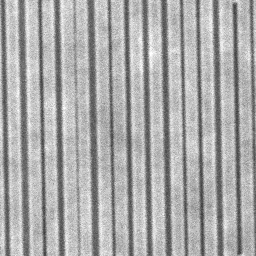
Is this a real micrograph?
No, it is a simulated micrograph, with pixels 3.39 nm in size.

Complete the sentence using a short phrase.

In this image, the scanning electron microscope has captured parallel lines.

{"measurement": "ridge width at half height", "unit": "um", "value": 0.0399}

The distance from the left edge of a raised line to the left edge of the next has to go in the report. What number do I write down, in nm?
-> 60.5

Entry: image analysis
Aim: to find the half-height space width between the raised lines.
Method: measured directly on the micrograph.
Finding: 23.3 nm